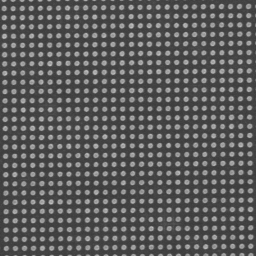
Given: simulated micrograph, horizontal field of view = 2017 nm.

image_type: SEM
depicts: a regular array of raised bodies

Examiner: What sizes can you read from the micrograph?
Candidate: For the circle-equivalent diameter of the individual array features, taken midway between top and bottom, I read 0.0355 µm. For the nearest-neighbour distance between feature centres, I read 70.1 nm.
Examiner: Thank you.